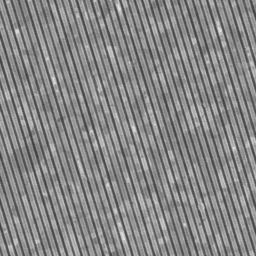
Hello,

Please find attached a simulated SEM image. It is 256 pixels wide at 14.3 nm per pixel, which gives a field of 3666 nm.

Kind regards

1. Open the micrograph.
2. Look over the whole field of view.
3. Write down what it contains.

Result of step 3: parallel lines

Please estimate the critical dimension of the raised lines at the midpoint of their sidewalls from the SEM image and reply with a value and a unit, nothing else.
59.9 nanometers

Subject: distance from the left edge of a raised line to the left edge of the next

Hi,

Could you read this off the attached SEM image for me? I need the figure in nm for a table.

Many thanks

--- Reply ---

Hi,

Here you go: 99.3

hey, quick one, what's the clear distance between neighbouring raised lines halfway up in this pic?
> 35.9 nm